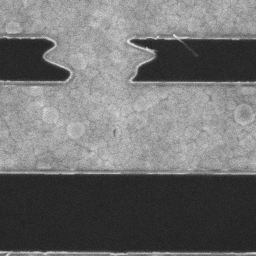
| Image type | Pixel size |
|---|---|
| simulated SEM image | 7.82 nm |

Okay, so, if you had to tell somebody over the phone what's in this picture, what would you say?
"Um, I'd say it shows one or a few lines or trenches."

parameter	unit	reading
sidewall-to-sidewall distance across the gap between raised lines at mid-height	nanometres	693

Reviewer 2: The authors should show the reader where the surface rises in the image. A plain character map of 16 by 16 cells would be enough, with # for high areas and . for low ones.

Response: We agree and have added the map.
................
................
###.....########
###......#######
####....########
................
................
................
................
................
................
################
################
################
################
################